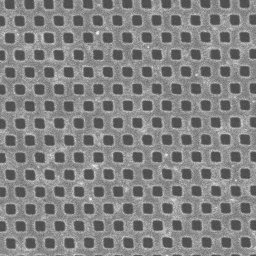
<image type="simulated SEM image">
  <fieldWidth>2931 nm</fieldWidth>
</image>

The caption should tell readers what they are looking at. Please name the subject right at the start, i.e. a regular array of holes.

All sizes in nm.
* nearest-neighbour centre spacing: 220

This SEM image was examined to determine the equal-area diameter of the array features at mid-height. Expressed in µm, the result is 0.13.